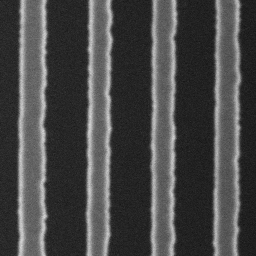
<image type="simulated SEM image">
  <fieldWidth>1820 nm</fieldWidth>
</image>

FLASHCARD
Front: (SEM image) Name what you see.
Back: lines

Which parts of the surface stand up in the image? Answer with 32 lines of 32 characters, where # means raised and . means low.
...###.....###.....###.....###..
...###.....###.....###.....###..
...###.....###.....###.....###..
...###.....###.....###.....###..
...###.....###.....###.....###..
...###.....###.....###.....###..
...###.....###.....###.....###..
...###.....###.....###.....###..
...###.....###.....###.....###..
...###.....###.....###.....###..
...###.....###.....###.....###..
...###.....###.....###.....###..
...###.....###.....###.....###..
...###.....###.....###.....###..
...###.....###.....###.....###..
..###......###.....###.....###..
..####.....###.....###.....###..
...###.....###.....###.....###..
...###.....###.....###.....###..
..####.....###.....###.....###..
..####.....###.....###.....###..
..####.....###.....###.....###..
..####.....###.....###.....###..
..####.....###.....###.....###..
..####.....###.....###.....###..
..####.....###.....###.....###..
..####.....###.....###.....###..
...###.....###.....###.....###..
...###.....###.....###.....###..
...##......###.....###.....###..
..###......##......###.....###..
..####.....##......###.....###..